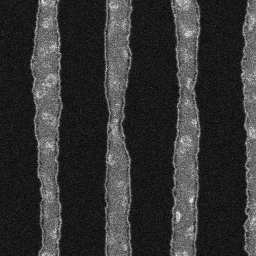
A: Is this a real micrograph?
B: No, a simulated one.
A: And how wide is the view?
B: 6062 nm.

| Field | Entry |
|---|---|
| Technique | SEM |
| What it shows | one or a few lines or trenches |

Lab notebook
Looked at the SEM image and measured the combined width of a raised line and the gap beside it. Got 1.64 µm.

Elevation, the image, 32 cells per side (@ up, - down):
@@@@@--@@@@@@---@@@@@@---@@@@@@-
@@@@@--@@@@@@---@@@@@@---@@@@@@-
@@@@@--@@@@@@---@@@@@@---@@@@@@-
@@@@@--@@@@@@---@@@@@@---@@@@@@-
@@@@---@@@@@@---@@@@@@---@@@@@@-
@@@@---@@@@@@---@@@@@@---@@@@@@-
@@@@---@@@@@@---@@@@@@---@@@@@@-
@@@@---@@@@@@---@@@@@@---@@@@@--
@@@@---@@@@@@---@@@@@@---@@@@@--
@@@@---@@@@@@---@@@@@@---@@@@@--
@@@@---@@@@@@---@@@@@@@-@@@@@@@-
@@@@---@@@@@@---@@@@@@@-@@@@@@@-
@@@@----@@@@@---@@@@@@@-@@@@@@@-
@@@@@---@@@@@@-@@@@@@@---@@@@@@-
@@@@@--@@@@@@@-@@@@@@@---@@@@@@-
@@@@---@@@@@@@-@@@@@@@---@@@@@@-
@@@@---@@@@@@--@@@@@@@---@@@@@@-
@@@@@--@@@@@@--@@@@@@@---@@@@@@-
@@@@@--@@@@@@---@@@@@@---@@@@@@-
@@@@@--@@@@@@---@@@@@@---@@@@@@-
@@@@@--@@@@@@---@@@@@@---@@@@@@-
@@@@@--@@@@@@---@@@@@@---@@@@@@-
@@@@@--@@@@@@---@@@@@@---@@@@@@-
@@@@@--@@@@@@---@@@@@@---@@@@@@-
@@@@@--@@@@@@---@@@@@@---@@@@@@-
@@@@@--@@@@@@---@@@@@@--@@@@@@@-
@@@@@--@@@@@@---@@@@@@---@@@@@@-
@@@@@---@@@@@---@@@@@@---@@@@@@-
@@@@@--@@@@@@---@@@@@@---@@@@@@-
@@@@@--@@@@@@---@@@@@@--@@@@@@@-
@@@@@--@@@@@@---@@@@@---@@@@@@@-
@@@@@--@@@@@@---@@@@@---@@@@@@@-